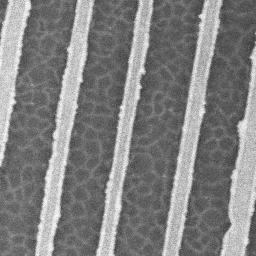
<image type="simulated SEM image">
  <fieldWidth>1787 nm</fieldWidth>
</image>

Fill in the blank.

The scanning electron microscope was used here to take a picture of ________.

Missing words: one or a few lines or trenches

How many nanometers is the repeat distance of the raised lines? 440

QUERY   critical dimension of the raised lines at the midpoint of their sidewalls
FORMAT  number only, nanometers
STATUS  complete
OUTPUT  114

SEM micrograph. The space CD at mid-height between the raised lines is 321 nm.